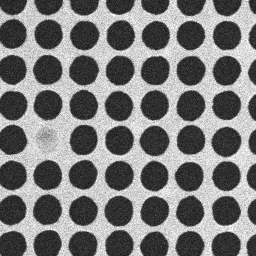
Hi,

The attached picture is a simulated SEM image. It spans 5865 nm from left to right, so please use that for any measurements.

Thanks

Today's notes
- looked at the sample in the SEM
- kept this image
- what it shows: a regular array of holes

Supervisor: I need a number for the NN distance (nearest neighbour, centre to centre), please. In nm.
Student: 798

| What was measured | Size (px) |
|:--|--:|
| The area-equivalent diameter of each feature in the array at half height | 29.3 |